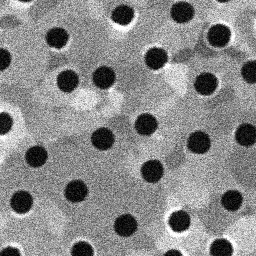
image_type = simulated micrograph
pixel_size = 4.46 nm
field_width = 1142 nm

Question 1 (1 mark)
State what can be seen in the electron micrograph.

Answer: a regular array of holes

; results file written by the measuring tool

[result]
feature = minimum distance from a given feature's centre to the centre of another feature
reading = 47.9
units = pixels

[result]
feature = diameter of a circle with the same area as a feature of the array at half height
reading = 23.8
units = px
